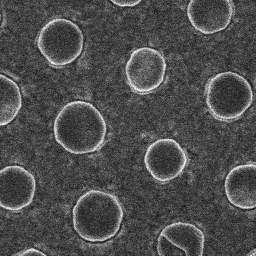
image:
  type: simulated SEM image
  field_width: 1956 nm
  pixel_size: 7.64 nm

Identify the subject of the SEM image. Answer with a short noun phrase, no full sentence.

raised bodies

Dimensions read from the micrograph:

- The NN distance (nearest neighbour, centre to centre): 672 nanometers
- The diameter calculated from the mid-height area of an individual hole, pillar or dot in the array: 344 nm